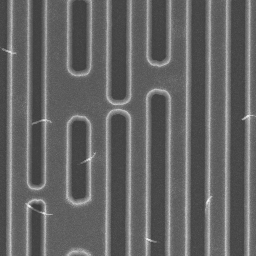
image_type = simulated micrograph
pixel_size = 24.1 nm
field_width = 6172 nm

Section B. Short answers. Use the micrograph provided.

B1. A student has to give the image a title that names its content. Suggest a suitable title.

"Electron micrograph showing parallel lines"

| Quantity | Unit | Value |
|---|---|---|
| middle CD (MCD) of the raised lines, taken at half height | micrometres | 0.521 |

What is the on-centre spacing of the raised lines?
957 nm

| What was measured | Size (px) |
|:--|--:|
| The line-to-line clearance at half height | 18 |